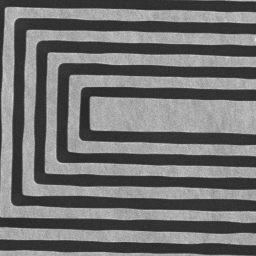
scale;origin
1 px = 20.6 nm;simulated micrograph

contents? groups of lines, slits or small figures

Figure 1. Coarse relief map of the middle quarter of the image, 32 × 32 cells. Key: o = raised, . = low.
...........................ooooo
................................
................................
.ooooooooooooooooooooooooooooooo
.ooooooooooooooooooooooooooooooo
.ooooooooooooooooooooooooooooooo
.ooo............................
.ooo............................
.ooo...oooooooooooo.............
.ooo..oooooooooooooooooooooooooo
.ooo..oooooooooooooooooooooooooo
.ooo..oooooooooooooooooooooooooo
.ooo..oooooooooooooooooooooooooo
.ooo..oooooooooooooooooooooooooo
.ooo..oooooooooooooooooooooooooo
.ooo...ooooooooooooooooooooooooo
.ooo...ooooooooooooooooooooooooo
.ooo............................
.ooo............................
.oooooo.........................
.ooooooooooooooooooooooooooooooo
.ooooooooooooooooooooooooooooooo
...............................o
................................
................................
oooooooooooooooooooooooooooooooo
oooooooooooooooooooooooooooooooo
ooo...oooooooooooooooooooooooooo
................................
................................
oo..............................
oooooooooooooooooooooooooooooooo